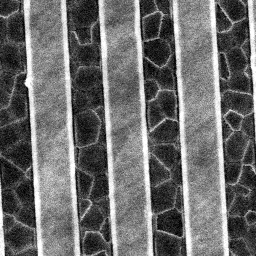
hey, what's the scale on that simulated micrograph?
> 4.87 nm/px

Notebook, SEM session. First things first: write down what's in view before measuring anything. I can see one or a few lines or trenches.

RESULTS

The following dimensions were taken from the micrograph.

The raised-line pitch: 363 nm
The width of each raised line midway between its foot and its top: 38.1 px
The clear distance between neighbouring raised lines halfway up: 181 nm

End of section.